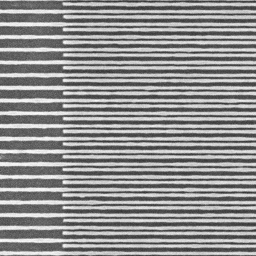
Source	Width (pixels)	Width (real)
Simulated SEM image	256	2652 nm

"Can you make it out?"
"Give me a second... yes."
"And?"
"parallel lines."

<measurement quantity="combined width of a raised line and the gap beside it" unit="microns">0.0662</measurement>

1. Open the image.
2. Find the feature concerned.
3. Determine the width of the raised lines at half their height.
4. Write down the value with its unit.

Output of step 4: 0.0285 micrometres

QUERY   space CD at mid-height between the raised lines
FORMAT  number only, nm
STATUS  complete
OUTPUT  46.6